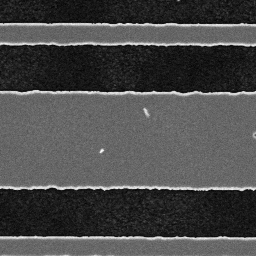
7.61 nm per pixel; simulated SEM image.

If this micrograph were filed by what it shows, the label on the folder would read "lines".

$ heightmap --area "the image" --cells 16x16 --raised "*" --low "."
................
************...*
****************
................
................
................
****************
****************
****************
****************
****************
****************
................
................
................
****************